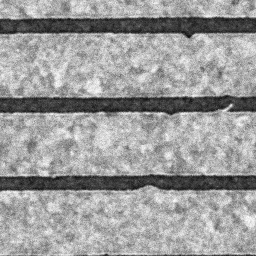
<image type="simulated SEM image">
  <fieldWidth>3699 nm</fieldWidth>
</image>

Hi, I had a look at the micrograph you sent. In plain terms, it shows one or a few lines or trenches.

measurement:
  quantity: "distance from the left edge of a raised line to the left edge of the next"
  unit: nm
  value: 1140